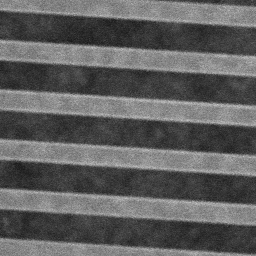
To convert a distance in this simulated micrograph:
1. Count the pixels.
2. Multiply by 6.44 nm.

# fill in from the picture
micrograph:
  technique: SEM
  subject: parallel lines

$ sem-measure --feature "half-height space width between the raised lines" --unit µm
0.202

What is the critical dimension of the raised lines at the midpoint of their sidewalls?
115 nm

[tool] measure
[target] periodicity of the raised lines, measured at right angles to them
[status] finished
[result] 319 nanometres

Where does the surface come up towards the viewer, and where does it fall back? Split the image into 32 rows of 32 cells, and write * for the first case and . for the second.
************************........
......**************************
.....................***********
................................
................................
*****...........................
*********************...........
...*****************************
.................***************
................................
................................
***.............................
******************..............
********************************
..............******************
.............................***
................................
................................
**************..................
*****************************...
...........*********************
...........................*****
................................
................................
***********.....................
**************************......
........************************
........................********
................................
................................
********........................
************************........